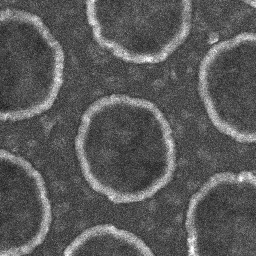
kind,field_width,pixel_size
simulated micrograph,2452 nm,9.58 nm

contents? raised bodies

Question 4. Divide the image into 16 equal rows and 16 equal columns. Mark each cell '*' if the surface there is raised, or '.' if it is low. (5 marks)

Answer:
......******....
**....******....
***...*****....*
****....**...***
****.........***
****.........***
***...***....***
.....*****...***
.....******....*
.....******.....
**...******.....
***...****...***
***.........****
***.........****
***...*.....****
**..*****...****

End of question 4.